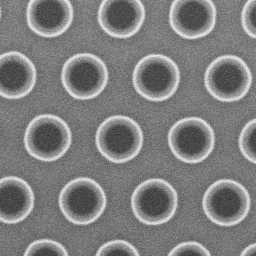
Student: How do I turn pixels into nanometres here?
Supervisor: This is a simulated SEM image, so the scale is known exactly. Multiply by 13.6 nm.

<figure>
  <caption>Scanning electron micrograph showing an array of small figures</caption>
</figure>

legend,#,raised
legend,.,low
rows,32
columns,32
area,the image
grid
....#####....#####....#####....#
....#####...######...######...##
....#####...######...######...##
....####.....####.....#####....#
......#.......##.......##......#
................................
................................
####.....###......###......###..
####....#####....#####....#####.
####....#####....#####....#####.
####....#####....#####....#####.
####.....###.....#####....#####.
...................#........#...
................................
.....#..........................
....####.....####.....####.....#
...######...######...######...##
...######...######...######...##
...#####....#####....#####....##
....####.....####.....####.....#
................................
................................
###......##........#............
####....#####....####.....####..
####....#####....#####....#####.
####...######....#####...######.
####....#####....#####....#####.
###......###......###.....####..
................................
................................
....###......###.......##.......
...#####....#####....#####....##